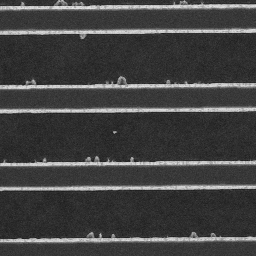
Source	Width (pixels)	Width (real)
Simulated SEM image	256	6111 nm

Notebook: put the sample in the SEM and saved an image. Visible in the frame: lines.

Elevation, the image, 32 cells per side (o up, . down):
................................
oooooooooooooooooooooooooooooooo
oooooooooooooooooooooooooooooooo
oooooooooooooooooooooooooooooooo
................................
................................
................................
................................
................................
................................
................................
oooooooooooooooooooooooooooooooo
oooooooooooooooooooooooooooooooo
oooooooooooooooooooooooooooooooo
................................
................................
................................
................................
................................
................................
.........ooooooooooooooooooooooo
oooooooooooooooooooooooooooooooo
oooooooooooooooooooooooooooooooo
ooooooooooooooooooooo...........
................................
................................
................................
................................
................................
................................
oooooooooooooooooooooooooooooooo
oooooooooooooooooooooooooooooooo